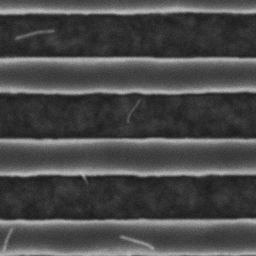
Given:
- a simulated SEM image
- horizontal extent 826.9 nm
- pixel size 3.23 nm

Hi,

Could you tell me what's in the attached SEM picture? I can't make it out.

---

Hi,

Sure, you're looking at lines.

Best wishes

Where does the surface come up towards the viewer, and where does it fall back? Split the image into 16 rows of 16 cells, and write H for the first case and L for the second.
HHHHHHHHHHHHHHHH
LLLLLLLLLLLLLLLL
LLLLLLLLLLLLLLLL
LLLLLLLLLLLLLLLL
HHHHHHHHHHHHHHHH
HHHHHHHHHHHHHHHH
LLLLLLLLLLLLLLLL
LLLLLLLLLLLLLLLL
LLLLLLLLLLLLLLLL
HHHHHHHHHHHHHHHH
HHHHHHHHHHHHHHHH
LLLLLLLLLLLLLLLL
LLLLLLLLLLLLLLLL
LLLLLLLLLLLLLLLL
HHHHHHHHHHHHHHHH
HHHHHHHHHHHHHHHH